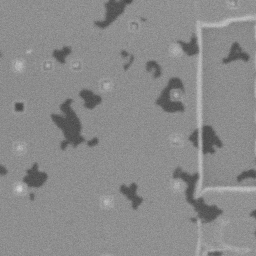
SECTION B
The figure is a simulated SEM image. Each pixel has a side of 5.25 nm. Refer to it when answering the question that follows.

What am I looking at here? wiring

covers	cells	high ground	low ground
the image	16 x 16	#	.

################
##############..
############....
############....
############....
############....
############....
############....
############....
#############...
#############...
#############...
################
################
################
################